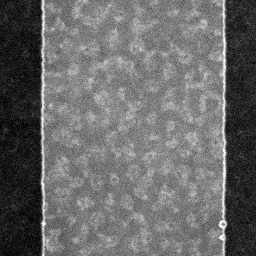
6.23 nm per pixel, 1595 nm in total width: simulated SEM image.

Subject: one or a few lines or trenches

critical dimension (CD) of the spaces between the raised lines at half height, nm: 1120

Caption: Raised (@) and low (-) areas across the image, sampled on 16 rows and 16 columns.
@@@-----------@@
@@@-----------@@
@@@-----------@@
@@@-----------@@
@@@-----------@@
@@@-----------@@
@@@-----------@@
@@@-----------@@
@@@-----------@@
@@@-----------@@
@@@-----------@@
@@@-----------@@
@@@-----------@@
@@@-----------@@
@@@-----------@@
@@@-----------@@